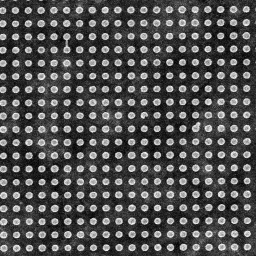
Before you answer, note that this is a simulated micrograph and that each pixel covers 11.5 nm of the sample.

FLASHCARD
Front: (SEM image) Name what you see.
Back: a regular array of raised bodies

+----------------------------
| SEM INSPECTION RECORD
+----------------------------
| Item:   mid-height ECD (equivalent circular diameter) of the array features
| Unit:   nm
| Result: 75.9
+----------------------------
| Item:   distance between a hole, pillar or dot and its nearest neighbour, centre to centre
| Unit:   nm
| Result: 146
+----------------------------